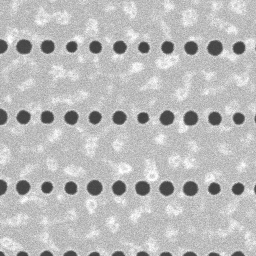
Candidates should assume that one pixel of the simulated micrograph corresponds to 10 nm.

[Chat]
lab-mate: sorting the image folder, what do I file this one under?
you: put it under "a regular array of holes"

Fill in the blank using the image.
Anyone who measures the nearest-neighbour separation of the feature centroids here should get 238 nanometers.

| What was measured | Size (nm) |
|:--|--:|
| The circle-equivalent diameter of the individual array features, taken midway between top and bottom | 143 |